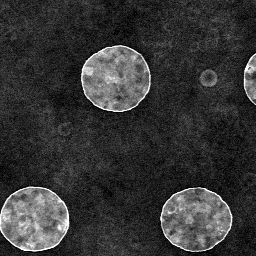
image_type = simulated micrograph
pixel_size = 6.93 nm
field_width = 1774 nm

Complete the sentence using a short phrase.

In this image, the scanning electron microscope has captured raised bodies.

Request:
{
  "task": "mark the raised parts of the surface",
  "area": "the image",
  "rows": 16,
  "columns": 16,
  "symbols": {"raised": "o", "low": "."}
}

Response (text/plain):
................
................
................
......ooo.......
.....oooo......o
.....oooo......o
......ooo.......
................
................
................
................
................
oooo.......ooo..
oooo......oooo..
oooo......oooo..
.oo........oo...